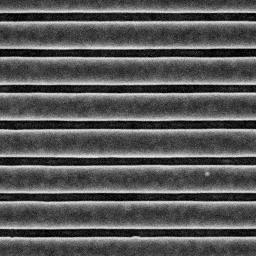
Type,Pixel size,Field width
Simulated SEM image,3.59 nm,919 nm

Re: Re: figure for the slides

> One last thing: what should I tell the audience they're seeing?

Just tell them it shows parallel lines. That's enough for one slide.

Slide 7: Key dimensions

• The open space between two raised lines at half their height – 29.6 nm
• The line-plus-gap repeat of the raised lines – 129 nm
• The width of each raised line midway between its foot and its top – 98.7 nanometers